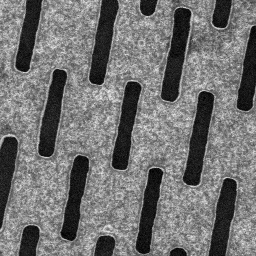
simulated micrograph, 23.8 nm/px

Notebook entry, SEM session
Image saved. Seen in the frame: holes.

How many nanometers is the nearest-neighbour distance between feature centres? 1790